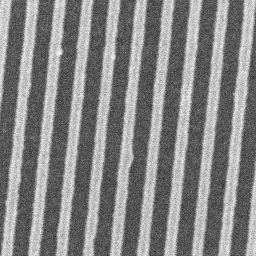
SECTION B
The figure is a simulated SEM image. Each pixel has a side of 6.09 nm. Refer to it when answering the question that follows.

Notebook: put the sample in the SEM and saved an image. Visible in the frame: parallel lines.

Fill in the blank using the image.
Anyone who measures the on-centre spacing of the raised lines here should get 165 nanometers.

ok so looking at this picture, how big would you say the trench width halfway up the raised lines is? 108 nm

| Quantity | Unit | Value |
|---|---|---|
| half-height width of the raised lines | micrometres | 0.0567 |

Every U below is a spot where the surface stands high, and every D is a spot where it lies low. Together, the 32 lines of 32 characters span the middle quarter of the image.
DDDUUDDDDDUUDDDDDUUDDDDDUUDDDDUU
DDDUUDDDDDUUDDDDUUUDDDDUUUDDDDUU
DDDUUDDDDDUUDDDDUUUDDDDUUDDDDDUU
DDDUUDDDDDUUDDDDUUDDDDDUUDDDDDUU
DDDUUDDDDDUUDDDDUUDDDDDUUDDDDDUU
DDDUUDDDDUUUDDDDUUDDDDDUUDDDDDUU
DDUUUDDDDUUUDDDDUUDDDDDUUDDDDDUU
DDUUUDDDDUUDDDDDUUDDDDDUUDDDDUUU
DDUUUDDDDUUDDDDDUUDDDDDUUDDDDDUD
DDUUUDDDDUUDDDDDUUDDDDUUUDDDDUUU
DDUUDDDDDUUDDDDDUUDDDDDUDDDDDUUD
DDUUDDDDDUUDDDDDUUDDDDUUDDDDDUUD
DDUUDDDDDUUDDDDUUUDDDDUUDDDDDUUD
DDUUDDDDDUUDDDDUUUDDDDUUDDDDDUUD
DDUUDDDDUUDDDDDUUDDDDDUUDDDDDUUD
DUUUDDDDUUDDDDDUUDDDDDUUDDDDDUUD
DUUUDDDDUUDDDDDUUDDDDDUUDDDDUUUD
DUUDDDDDUUDDDDDUUDDDDDUUDDDDUUUD
DUUDDDDDUUDDDDDUUDDDDDUUDDDDUUUD
DUUDDDDDUUDDDDDUUDDDDUUUDDDDUUUD
DUUDDDDDUUDDDDDUUDDDDUUDDDDDUUDD
DUUDDDDDUUDDDDDUUDDDDUUDDDDDUUDD
DUUDDDDDUUDDDDUUUDDDDUUDDDDDUUDD
DUUDDDDDUUDDDDUUUDDDDUUDDDDDUUDD
UUUDDDDUUUDDDDUUUDDDDUUDDDDDUUDD
UUUDDDDUUUDDDDUUUDDDDUUDDDDDUUDD
UUUDDDDUUDDDDDUUDDDDDUUDDDDUUUDD
UUUDDDDUUDDDDDUUDDDDDUUDDDDUUUDD
UUDDDDDUUDDDDDUUDDDDDUUDDDDUUDDD
UUDDDDDUUDDDDDUUDDDDDUUDDDDUUDDD
UUDDDDDUUDDDDDUUDDDDUUUDDDDUUDDD
UUDDDDDUUDDDDUUUDDDDUUDDDDDUUDDD